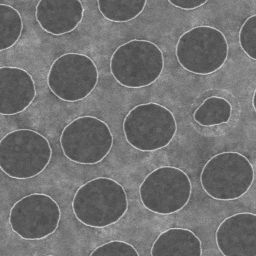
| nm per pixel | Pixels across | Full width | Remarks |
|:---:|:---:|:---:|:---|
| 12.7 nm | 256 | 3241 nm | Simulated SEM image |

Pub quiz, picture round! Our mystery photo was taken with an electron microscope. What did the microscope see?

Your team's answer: a regular array of raised bodies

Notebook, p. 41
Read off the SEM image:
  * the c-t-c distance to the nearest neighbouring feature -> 816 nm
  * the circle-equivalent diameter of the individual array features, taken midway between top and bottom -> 635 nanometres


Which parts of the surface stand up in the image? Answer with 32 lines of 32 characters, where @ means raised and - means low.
-----@@@@@--@@@@@@----@@@-------
@@---@@@@@---@@@@@--------------
@@@--@@@@@----@@---------------@
@@@--@@@@---------------@@@---@@
@@---------------------@@@@@--@@
@@--------------@@@---@@@@@@--@@
--------------@@@@@@--@@@@@@---@
-------@@@@---@@@@@@--@@@@@@----
@@----@@@@@@--@@@@@@---@@@@-----
@@@@--@@@@@@--@@@@@@------------
@@@@--@@@@@@---@@@@-------------
@@@@---@@@@---------------------
@@@@----@@----------------@@----
@@@--------------@@@@----@@@@---
----------------@@@@@@--@@@@@---
---------@@@@--@@@@@@@---@@@----
--@@----@@@@@@--@@@@@@----------
@@@@@@--@@@@@@--@@@@@-----------
@@@@@@--@@@@@@---@@@------------
@@@@@@--@@@@@--------------@@@--
@@@@@@--------------------@@@@@-
-@@@@--------------@@@@--@@@@@@@
------------@@----@@@@@@-@@@@@@@
----------@@@@@---@@@@@@-@@@@@@-
---@@@---@@@@@@@--@@@@@@--@@@@--
--@@@@@--@@@@@@@--@@@@@---------
-@@@@@@--@@@@@@@---@@@----------
-@@@@@@---@@@@@-------------@@@@
-@@@@@@--------------------@@@@@
--@@@@--------------@@@@---@@@@@
-------------@@@---@@@@@@--@@@@@
------------@@@@@--@@@@@@---@@@@